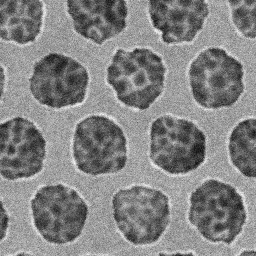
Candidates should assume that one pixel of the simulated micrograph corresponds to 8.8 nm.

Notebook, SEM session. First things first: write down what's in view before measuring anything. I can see a regular array of holes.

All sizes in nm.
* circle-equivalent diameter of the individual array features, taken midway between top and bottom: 518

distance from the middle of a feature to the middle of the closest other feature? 0.677 um